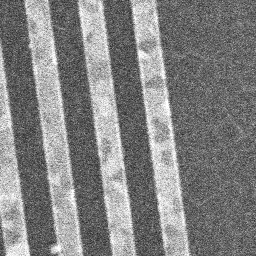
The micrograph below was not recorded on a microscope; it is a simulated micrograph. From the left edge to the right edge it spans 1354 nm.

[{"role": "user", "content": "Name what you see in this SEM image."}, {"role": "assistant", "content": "parallel lines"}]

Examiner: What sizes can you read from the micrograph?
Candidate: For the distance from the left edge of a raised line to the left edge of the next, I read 0.279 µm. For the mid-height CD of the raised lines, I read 114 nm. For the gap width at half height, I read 168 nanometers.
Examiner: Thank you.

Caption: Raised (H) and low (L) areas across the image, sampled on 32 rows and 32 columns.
LLLHHHLLLLHHHLLLLHHLLLLLLLLLLLLL
LLLHHHLLLLHHHLLLLHHLLLLLLLLLLLLL
LLLHHHLLLLHHHLLLLHHHLLLLLLLLLLLL
LLLLHHLLLLHHHLLLLHHHLLLLLLLLLLLL
LLLLHHLLLLHHHLLLLHHHLLLLLLLLLLLL
LLLLHHHLLLLHHLLLLHHHLLLLLLLLLLLL
LLLLHHHLLLLHHLLLLHHHLLLLLLLLLLLL
LLLLHHHLLLLHHHLLLLHHLLLLLLLLLLLL
LLLLHHHLLLLHHHLLLLHHLLLLLLLLLLLL
HLLLHHHLLLLHHHLLLLHHHLLLLLLLLLLL
HLLLLHHLLLLHHHLLLLHHHLLLLLLLLLLL
HLLLLHHLLLLHHHLLLLHHHLLLLLLLLLLL
HLLLLHHHLLLLHHLLLLHHHLLLLLLLLLLL
HLLLLHHHLLLLHHLLLLHHHLLLLLLLLLLL
HLLLLHHHLLLLHHLLLLHHHLLLLLLLLLLL
HLLLLHHHLLLLHHHLLLLHHLLLLLLLLLLL
HLLLLHHHLLLLHHHLLLLHHLLLLLLLLLLL
HHLLLLHHLLLLHHHLLLLHHHLLLLLLLLLL
HHLLLLHHLLLLHHHLLLLHHHLLLLLLLLLL
HHLLLLHHHLLLLHHLLLLHHHLLLLLLLLLL
HHLLLLHHHLLLLHHLLLLHHHLLLLLLLLLL
HHLLLLHHHLLLLHHLLLLHHHLLLLLLLLLL
HHLLLLHHHLLLLHHHLLLLHHLLLLLLLLLL
HHLLLLHHHLLLLHHHLLLLHHLLLLLLLLLL
HHHLLLHHHLLLLHHHLLLLHHHLLLLLLLLL
HHHLLLLHHLLLLHHHLLLLHHHLLLLLLLLL
HHHLLLLHHLLLLHHHLLLLHHHLLLLLLLLL
HHHLLLLHHHLLLLHHLLLLHHHLLLLLLLLL
HHHLLLLHHHLLLLHHLLLLHHHLLLLLLLLL
LHHLLLLHHHLLLLHHLLLLLHHLLLLLLLLL
LHHLLLLHHHLLLLHHHLLLLHHLLLLLLLLL
LHHHLLLHHHLLLLHHHLLLLHHHLLLLLLLL